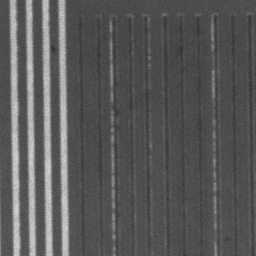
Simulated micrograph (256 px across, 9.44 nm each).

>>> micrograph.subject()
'parallel lines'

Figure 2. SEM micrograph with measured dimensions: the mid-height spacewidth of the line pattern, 11.7 px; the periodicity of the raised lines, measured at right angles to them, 0.159 um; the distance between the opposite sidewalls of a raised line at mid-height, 51.9 nanometres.